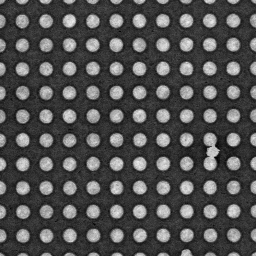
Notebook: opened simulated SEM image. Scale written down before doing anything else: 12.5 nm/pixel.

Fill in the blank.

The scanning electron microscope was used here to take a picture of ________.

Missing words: a regular array of raised bodies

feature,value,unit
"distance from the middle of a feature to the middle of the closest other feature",293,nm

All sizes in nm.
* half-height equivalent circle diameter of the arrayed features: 173